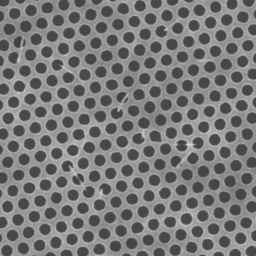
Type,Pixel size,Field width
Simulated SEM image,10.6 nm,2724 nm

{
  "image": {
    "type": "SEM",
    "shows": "a regular array of holes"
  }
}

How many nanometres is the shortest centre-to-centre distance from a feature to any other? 174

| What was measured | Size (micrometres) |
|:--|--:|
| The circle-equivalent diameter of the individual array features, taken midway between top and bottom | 0.122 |